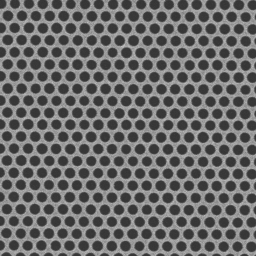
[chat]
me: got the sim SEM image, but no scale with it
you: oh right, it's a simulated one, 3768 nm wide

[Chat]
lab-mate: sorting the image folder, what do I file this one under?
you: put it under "a regular array of holes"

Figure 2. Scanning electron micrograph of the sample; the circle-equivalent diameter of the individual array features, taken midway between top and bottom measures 157 nanometers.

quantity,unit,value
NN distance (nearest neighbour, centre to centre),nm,199